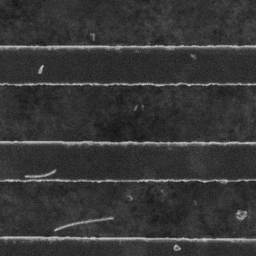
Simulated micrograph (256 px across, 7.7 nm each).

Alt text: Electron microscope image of lines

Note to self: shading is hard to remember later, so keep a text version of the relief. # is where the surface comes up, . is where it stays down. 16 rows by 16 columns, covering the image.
................
................
................
################
################
................
................
................
................
################
################
................
................
................
................
################